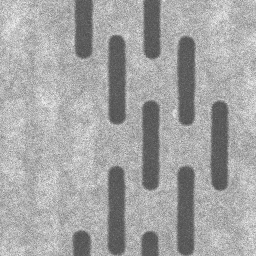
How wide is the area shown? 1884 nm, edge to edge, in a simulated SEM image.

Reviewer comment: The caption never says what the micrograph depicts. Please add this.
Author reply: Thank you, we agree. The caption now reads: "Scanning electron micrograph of holes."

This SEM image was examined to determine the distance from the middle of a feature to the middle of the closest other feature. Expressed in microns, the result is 0.51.